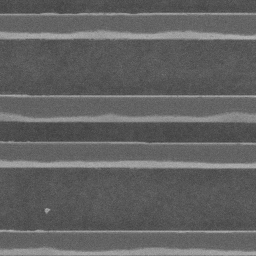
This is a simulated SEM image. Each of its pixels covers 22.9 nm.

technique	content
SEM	lines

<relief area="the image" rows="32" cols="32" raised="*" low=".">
................................
................................
********************************
********************************
......***.......****.....*******
................................
................................
................................
................................
................................
................................
................................
********************************
********************************
********************************
................................
................................
................................
********************************
********************************
********************************
................................
................................
................................
................................
................................
................................
................................
................................
********************************
********************************
****..************..************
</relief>